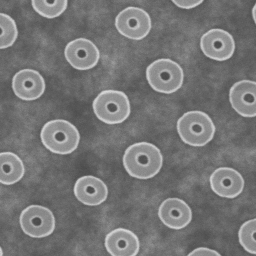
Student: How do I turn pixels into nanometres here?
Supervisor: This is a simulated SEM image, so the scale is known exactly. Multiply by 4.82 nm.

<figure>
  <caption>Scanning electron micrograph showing a regular array of ring-shaped raised bodies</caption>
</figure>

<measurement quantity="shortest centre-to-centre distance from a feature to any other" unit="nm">292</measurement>